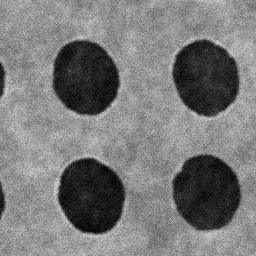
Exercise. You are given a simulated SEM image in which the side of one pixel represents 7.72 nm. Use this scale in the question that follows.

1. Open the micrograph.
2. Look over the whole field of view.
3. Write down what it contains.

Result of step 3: holes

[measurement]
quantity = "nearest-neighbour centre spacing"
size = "889 nm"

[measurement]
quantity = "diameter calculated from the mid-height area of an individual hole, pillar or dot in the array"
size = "547 nm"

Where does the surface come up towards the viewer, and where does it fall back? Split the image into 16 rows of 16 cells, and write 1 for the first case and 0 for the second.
1111111111111111
1111111111111111
1111111111111111
1111000111100011
1110000111100001
1110000111100001
1111000111110011
1111111111111111
1111111111111111
1111111111111111
1111000111100011
1111000011100001
1111000011100001
1111000011100001
1111100111111111
1111111111111111